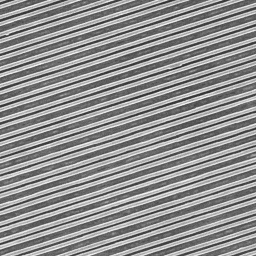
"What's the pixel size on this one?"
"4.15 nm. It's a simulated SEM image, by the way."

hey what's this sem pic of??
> parallel lines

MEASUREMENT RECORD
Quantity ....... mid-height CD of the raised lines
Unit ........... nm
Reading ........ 14.9